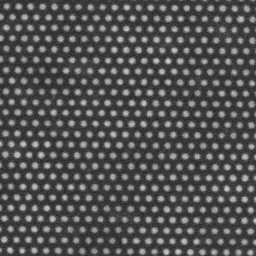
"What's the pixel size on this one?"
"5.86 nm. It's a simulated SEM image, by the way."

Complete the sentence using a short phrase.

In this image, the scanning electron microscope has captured a regular array of raised bodies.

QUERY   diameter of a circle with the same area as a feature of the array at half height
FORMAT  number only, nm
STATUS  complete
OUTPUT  30.3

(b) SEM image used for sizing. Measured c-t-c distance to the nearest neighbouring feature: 0.0692 micrometres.